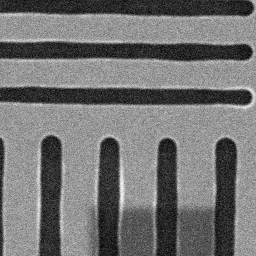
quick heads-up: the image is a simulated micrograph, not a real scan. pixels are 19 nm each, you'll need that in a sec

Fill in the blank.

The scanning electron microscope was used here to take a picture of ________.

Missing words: groups of lines, slits or small figures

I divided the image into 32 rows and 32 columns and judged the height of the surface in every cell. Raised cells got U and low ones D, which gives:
DDDDDDDDDDDDDDDDDDDDDDDDDDDDDDDD
DDDDDDDDDDDDDDDDDDDDDDDDDDDDDDDD
UUUUUUUUUUUUUUUUUUUUUUUUUUUUUUUU
UUUUUUUUUUUUUUUUUUUUUUUUUUUUUUUU
UUUUUUUUUUUUUUUUUUUUUUUUUUUUUUUU
DDDDDDDDDDDDDDDDDDDDDDDDDDDDDDDU
DDDDDDDDDDDDDDDDDDDDDDDDDDDDDDDD
UDDDDDDDDDUUUUUDDDDDDDDDDDDDDDDU
UUUUUUUUUUUUUUUUUUUUUUUUUUUUUUUU
UUUUUUUUUUUUUUUUUUUUUUUUUUUUUUUU
UUUUUUUUUUUUUUUUUUUUUUUUUUUUUUUU
DDDDDDDDDDDDDDDDDDDDDDDDDDDDDDDU
DDDDDDDDDDDDDDDDDDDDDDDDDDDDDDDD
UUUUUUUUUUUUUUUUUUUUUUUUUUUUUUUU
UUUUUUUUUUUUUUUUUUUUUUUUUUUUUUUU
UUUUUUUUUUUUUUUUUUUUUUUUUUUUUUUU
UUUUUUUUUUUUUUUUUUUUUUUUUUUUUUUU
UUUUUDDDUUUUUDDUUUUUDDUUUUUDDUUU
DUUUUDDDUUUUDDDUUUUUDDUUUUUDDDUU
DUUUUDDDUUUUDDDUUUUUDDUUUUUDDDUU
DUUUUDDDUUUUDDDUUUUUDDUUUUUDDDUU
DUUUUDDDUUUUDDDUUUUUDDUUUUUDDDUU
DUUUUDDDUUUUDDDUUUUUDDUUUUUDDDUU
DUUUUDDDUUUUDDDUUUUUDDUUUUUDDDUU
DUUUUDDDUUUUDDDUUUUDDDUUUUUDDDUU
UUUUUDDDUUUUDDDUUUUDDDUUUUUDDDUU
UUUUUDDDUUUUDDDUUUUDDDUUUUUDDUUU
UUUUUDDDUUUUDDDUUUUDDDUUUUUDDUUU
DUUUUDDDUUUUDDDUUUUDDDUUUUUDDUUU
DUUUUDDDUUUUDDDUUUUDDDUUUUUDDUUU
DUUUUDDDUUUUDDDUUUUDDDUUUUUDDUUU
DUUUUDDDUUUUDDDUUUUDDDUUUUUDDUUU